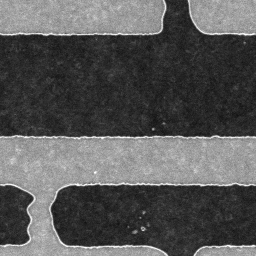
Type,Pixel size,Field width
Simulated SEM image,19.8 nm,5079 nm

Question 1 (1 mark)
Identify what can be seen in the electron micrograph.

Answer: one or a few lines or trenches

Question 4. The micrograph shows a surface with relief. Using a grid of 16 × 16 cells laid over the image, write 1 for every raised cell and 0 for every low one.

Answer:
0000000000110000
0000000000110000
1111111111111111
1111111111111111
1111111111111111
1111111111111111
1111111111111111
1111111111111111
1111111111111111
0000000000000000
0000000000000000
0000000010000000
1101111111111111
1101111111111111
1101111111111111
0000000000111000